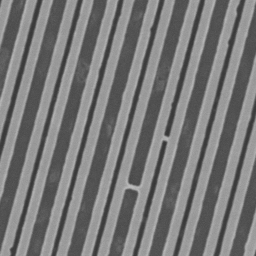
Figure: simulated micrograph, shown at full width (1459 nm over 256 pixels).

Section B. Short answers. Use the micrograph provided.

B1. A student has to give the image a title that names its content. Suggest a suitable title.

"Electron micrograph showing parallel lines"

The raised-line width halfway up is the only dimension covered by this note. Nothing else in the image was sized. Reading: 0.0586 micrometres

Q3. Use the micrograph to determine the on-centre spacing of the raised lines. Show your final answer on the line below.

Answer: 0.111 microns